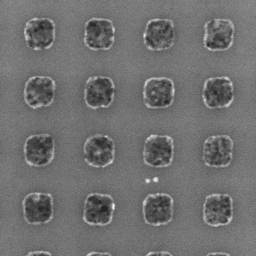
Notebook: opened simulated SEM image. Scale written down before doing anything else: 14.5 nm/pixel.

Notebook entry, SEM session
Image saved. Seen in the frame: a regular array of raised bodies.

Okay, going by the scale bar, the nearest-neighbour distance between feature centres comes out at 845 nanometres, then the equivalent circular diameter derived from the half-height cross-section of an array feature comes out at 0.452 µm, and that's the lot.